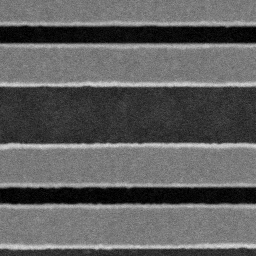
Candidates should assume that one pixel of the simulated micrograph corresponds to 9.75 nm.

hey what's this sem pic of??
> lines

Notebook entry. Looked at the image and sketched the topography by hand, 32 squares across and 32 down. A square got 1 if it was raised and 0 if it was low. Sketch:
11111111111111111111111111111111
11111111111111111111111111111111
11111111111111111111111111111111
00000000000000000000000000000000
00000000000000000000000000000000
11101001000100000000000000001101
11111111111111111111111111111111
11111111111111111111111111111111
11111111111111111111111111111111
11111111111111111111111111111111
11111111111111111111111111111111
00000000000000000000000000000000
00000000000000000000000000000000
00000000000000000000000000000000
00000000000000000000000000000000
00000000000000000000000000000000
00000000000000000000000000000000
00000000000000000000000000000000
11111111111111111111111111111111
11111111111111111111111111111111
11111111111111111111111111111111
11111111111111111111111111111111
11111111111111111111111111111111
00000000000000000000000000000000
00000000000000000000000000000000
00000000000000000000000000000000
11111111111111111111111111111111
11111111111111111111111111111111
11111111111111111111111111111111
11111111111111111111111111111111
11111111111111111111111111111111
00000000000000000000000000000000